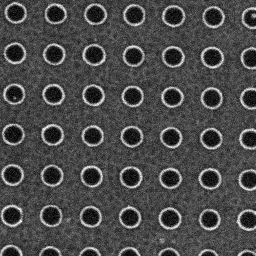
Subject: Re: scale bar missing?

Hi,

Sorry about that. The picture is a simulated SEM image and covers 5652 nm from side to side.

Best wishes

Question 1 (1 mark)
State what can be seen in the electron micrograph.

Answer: a regular array of raised bodies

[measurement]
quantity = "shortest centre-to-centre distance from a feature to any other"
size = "869 nm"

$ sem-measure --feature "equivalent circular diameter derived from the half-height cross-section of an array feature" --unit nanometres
449